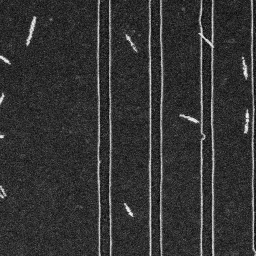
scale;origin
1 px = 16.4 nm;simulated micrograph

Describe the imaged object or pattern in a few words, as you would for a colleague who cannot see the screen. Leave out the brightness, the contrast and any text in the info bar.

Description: parallel lines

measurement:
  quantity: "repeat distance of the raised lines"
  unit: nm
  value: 842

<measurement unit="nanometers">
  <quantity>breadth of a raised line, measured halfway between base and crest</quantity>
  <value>673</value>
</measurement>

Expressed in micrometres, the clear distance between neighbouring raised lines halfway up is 0.172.